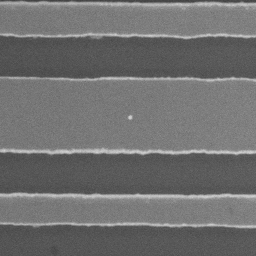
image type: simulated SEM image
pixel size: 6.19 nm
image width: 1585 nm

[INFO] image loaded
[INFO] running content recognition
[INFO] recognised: lines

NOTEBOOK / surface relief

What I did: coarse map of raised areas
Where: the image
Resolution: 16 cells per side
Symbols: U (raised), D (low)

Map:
UUUUUUUUUUUUUUUU
UUUUUUUUUUUUUUUU
DDDDDDDDDDDDDDDD
DDDDDDDDDDDDDDDD
DDDDDDDDDDDDDDDD
UUUUUUUUUUUUUUUU
UUUUUUUUUUUUUUUU
UUUUUUUUUUUUUUUU
UUUUUUUUUUUUUUUU
DUUUUUUUUUUUUUUU
DDDDDDDDDDDDDDDD
DDDDDDDDDDDDDDDD
UUUUUUUUUUUUUUUU
UUUUUUUUUUUUUUUU
DDDDDDDDDDDDDDDD
DDDDDDDDDDDDDDDD